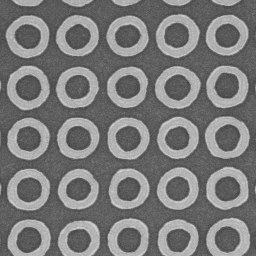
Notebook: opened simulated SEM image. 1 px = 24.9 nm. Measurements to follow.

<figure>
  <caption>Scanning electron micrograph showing a regular array of ring-shaped raised bodies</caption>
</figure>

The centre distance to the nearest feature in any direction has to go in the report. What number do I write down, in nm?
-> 1230